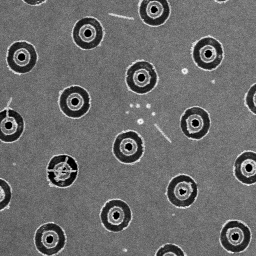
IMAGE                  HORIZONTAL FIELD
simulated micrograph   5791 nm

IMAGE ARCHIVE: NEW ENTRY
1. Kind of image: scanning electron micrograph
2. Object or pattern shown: a regular array of ring-shaped grooves with a dot in the middle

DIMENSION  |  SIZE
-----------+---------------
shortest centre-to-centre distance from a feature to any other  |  1560 nm